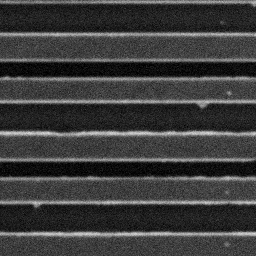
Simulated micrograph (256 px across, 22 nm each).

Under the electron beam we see lines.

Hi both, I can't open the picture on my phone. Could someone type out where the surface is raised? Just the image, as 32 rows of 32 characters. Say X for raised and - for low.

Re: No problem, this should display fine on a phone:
--------------------------------
--------------------------------
--------------------------------
--------------------------------
XXXXXXXXXXXXXXXXXXXXXXXXXXXXXXXX
XXXXXXXXXXXXXXXXXXXXXXXXXXXXXXXX
XXXXXXXXXXXXXXXXXXXXXXXXXXXXXXXX
XXXXXXXXXXXXXXXXXXXXXXXXXXXXXXXX
--------------------------------
--------------------------------
XXXXXXXXXXXXXXXXXXXXXXXXXXXXXXXX
XXXXXXXXXXXXXXXXXXXXXXXXXXXXXXXX
XXXXXXXXXXXXXXXXXXXXXXXXXXXXXXXX
--------------------------------
--------------------------------
--------------------------------
--------------------------------
XXXXXXXXXXXXXXXXXXXXXXXXXXXXXXXX
XXXXXXXXXXXXXXXXXXXXXXXXXXXXXXXX
XXXXXXXXXXXXXXXXXXXXXXXXXXXXXXXX
--------------------------------
--------------------------------
XXXXXXXXXXXXXXXXXXXXXXXXXXXXXXXX
XXXXXXXXXXXXXXXXXXXXXXXXXXXXXXXX
XXXXXXXXXXXXXXXXXXXXXXXXXXXXXXXX
--------------------------------
--------------------------------
--------------------------------
--------------------------------
XXXXXXXXXXXXXXXXXXXXXXXXXXXXXXXX
XXXXXXXXXXXXXXXXXXXXXXXXXXXXXXXX
XXXXXXXXXXXXXXXXXXXXXXXXXXXXXXXX